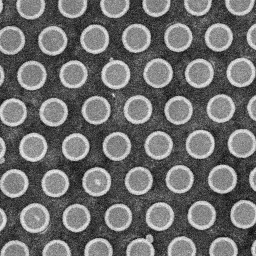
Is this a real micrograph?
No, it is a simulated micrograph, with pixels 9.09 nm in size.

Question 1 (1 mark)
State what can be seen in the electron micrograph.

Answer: a regular array of raised bodies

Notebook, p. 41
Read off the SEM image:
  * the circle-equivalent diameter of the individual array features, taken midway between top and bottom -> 236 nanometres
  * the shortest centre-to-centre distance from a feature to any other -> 369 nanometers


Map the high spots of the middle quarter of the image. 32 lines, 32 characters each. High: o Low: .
ooooo......ooooo.....ooooo.....o
ooooo.....oooooo....ooooooo....o
ooooo.....oooooo....ooooooo....o
ooooo.....oooooo....ooooooo....o
ooooo.....oooooo.....ooooo.....o
.ooo.......oooo........oo.......
................................
................................
.......oo........ooo........oo..
......ooooo.....ooooo.....ooooo.
.....oooooo.....ooooo.....oooooo
.....oooooo....ooooooo....oooooo
o....oooooo.....ooooo.....oooooo
.....oooooo.....ooooo.....ooooo.
.......ooo.......ooo.......ooo..
................................
................................
............oo........ooo.......
.oooo......ooooo.....ooooo.....o
oooooo....oooooo.....oooooo....o
oooooo....oooooo.....oooooo....o
oooooo....oooooo.....oooooo....o
ooooo......ooooo.....ooooo......
.ooo........ooo........o........
................................
................................
.......ooo.......oooo......oooo.
......ooooo.....ooooo.....oooooo
o....oooooo.....oooooo....oooooo
o....oooooo.....oooooo....oooooo
o....oooooo.....oooooo....oooooo
......ooooo.....ooooo......oooo.